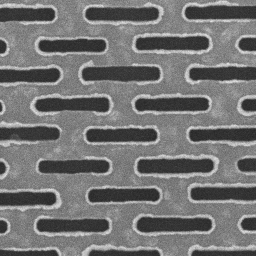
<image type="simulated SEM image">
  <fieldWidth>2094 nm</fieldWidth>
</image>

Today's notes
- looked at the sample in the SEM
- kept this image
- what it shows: a regular array of holes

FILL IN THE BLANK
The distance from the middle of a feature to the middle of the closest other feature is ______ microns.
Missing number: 0.474